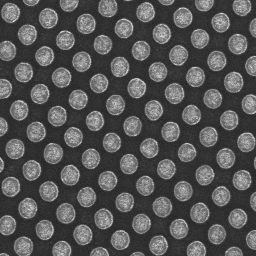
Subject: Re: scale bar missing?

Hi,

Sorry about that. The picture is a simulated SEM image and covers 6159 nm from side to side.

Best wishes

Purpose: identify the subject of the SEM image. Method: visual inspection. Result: a regular array of raised bodies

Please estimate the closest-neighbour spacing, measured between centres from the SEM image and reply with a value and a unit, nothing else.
636 nm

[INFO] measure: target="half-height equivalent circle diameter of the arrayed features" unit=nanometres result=458